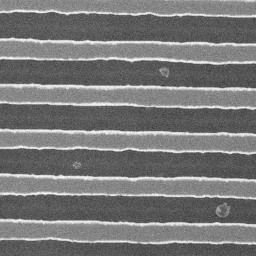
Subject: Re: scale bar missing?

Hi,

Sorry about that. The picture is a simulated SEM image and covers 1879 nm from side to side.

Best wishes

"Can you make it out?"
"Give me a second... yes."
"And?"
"lines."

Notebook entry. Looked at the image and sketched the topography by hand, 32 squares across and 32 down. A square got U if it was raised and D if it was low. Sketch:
UUUUUUUUUUUUUUUUUUUUUUUUUUUUUUUU
UUDDUUDUUUUUUUUUUUUUUUUUUUUUUUUU
DDDDDDDDDDDDDDDDDDDDDDDDDDDDDDDD
DDDDDDDDDDDDDDDDDDDDDDDDDDDDDDDD
DDDDDDDDDDDDDDDDDDDDDDDDDDDDDDDD
UUUUUUUUUUUUUUUUUUUUUUUUUUUDUUDD
UUUUUUUUUUUUUUUUUUUUUUUUUUUUUUUU
DDDDDDDDDDDDDDDDUDDDUUUUUUUUUUUU
DDDDDDDDDDDDDDDDDDDDDDDDDDDDDDDD
DDDDDDDDDDDDDDDDDDDDDDDDDDDDDDDD
DDDDDDDDDDDDDDDDDDDDDDDDDDDDDDDD
UUUUUUUUUUUUUUUUUUUUUUUUUUUUUUUU
UUUUUUUUUUUUUUUUUUUUUUUUUUUUUUUU
DDDDDDDDDDDDDDDDDDDDDDDDDDDDUUDU
DDDDDDDDDDDDDDDDDDDDDDDDDDDDDDDD
DDDDDDDDDDDDDDDDDDDDDDDDDDDDDDDD
UUUUUUUUUUUUUUUUUUUUUDDDDDDDDDDD
UUUUUUUUUUUUUUUUUUUUUUUUUUUUUUUU
UUUUUUUUUUUUUUUUUUUUUUUUUUUUUUUU
DDDDDDDDDDDDDDDDDDDDDDDDDDDDDDDD
DDDDDDDDDDDDDDDDDDDDDDDDDDDDDDDD
DDDDDDDDDDDDDDDDDDDDDDDDDDDDDDDD
UUUUUUUUUUUUUUUUUUUUUUUUUUUUUUUD
UUUUUUUUUUUUUUUUUUUUUUUUUUUUUUUU
DDDDDDDDDDDDDDDDDDDDUUUUUUUUUUUU
DDDDDDDDDDDDDDDDDDDDDDDDDDDDDDDD
DDDDDDDDDDDDDDDDDDDDDDDDDDDDDDDD
DUUDDDDDDDDDDDDDDDDDDDDDDDDDDDDD
UUUUUUUUUUUUUUUUUUUUUUUUUUUUUUUU
UUUUUUUUUUUUUUUUUUUUUUUUUUUUUUUU
DDDDDDDDDDDDDDDDDDDDDDDDDDDDDDDD
DDDDDDDDDDDDDDDDDDDDDDDDDDDDDDDD